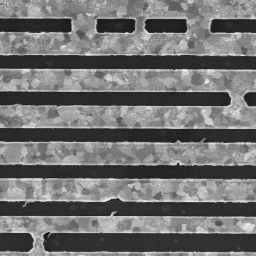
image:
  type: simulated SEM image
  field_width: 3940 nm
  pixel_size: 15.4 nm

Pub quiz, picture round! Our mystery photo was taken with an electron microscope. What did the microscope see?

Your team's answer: parallel lines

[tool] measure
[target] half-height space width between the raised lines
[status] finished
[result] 0.225 um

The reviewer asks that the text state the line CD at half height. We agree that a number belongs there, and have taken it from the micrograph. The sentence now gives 329 nm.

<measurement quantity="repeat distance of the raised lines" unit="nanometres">556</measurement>